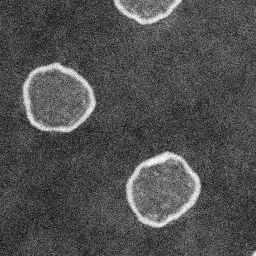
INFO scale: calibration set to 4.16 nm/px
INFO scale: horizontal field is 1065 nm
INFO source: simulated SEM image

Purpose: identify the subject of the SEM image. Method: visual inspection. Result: raised bodies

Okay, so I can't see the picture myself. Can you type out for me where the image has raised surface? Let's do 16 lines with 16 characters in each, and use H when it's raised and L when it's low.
LLLLLLLLHHHLLLLL
LLLLLLLLLLLLLLLL
LLLLLLLLLLLLLLLL
LLLLLLLLLLLLLLLL
LLHHLLLLLLLLLLLL
LLHHHHLLLLLLLLLL
LLHHHHLLLLLLLLLL
LLHHHLLLLLLLLLLL
LLLLLLLLLLLLLLLL
LLLLLLLLLLLLLLLL
LLLLLLLLLHHHLLLL
LLLLLLLLHHHHLLLL
LLLLLLLLHHHHLLLL
LLLLLLLLLHHLLLLL
LLLLLLLLLLLLLLLL
LLLLLLLLLLLLLLLL